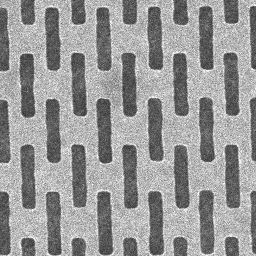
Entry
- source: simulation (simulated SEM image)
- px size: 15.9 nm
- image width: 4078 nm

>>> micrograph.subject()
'a regular array of holes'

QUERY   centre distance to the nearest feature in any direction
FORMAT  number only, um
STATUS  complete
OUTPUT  0.814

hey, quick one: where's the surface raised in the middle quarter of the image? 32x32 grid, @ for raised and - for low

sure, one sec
@@---@@@----@@@---@@@----@@----@
@@---@@@@--@@@@---@@@@--@@@----@
@@---@@@@@@@@@----@@@@@@@@@----@
@@---@@@@@@@@@----@@@@@@@@@----@
@@---@@@@@@@@@----@@@@@@@@@----@
@@----@@@@@@@@----@@@@@@@@@----@
@@----@@@@@@@@----@@@@@@@@@----@
@@----@@@@@@@@----@@@@@@@@@----@
@@----@@@@@@@@@---@@@@-@@@@----@
@@----@@----@@@---@@@---@@@----@
@@----@@----@@@---@@@---@@@----@
@@----@@----@@@---@@@----@@----@
@@----@@----@@@---@@@----@@@---@
@@@@@@@@----@@@@@@@@@----@@@@@@@
@@@@@@@@----@@@@@@@@@----@@@@@@@
@@@@@@@@----@@@@@@@@@----@@@@@@@
@@@@@@@@----@@@@@@@@@----@@@@@@@
@@@@@@@@----@@@@@@@@@----@@@@@@@
@@@@@@@@@---@@@@@@@@@----@@@@@@@
@@@@@@@@----@@@@@@@@@----@@@@@@@
@@---@@@----@@@---@@@----@@@--@@
@@---@@@----@@----@@@----@@@---@
@@---@@@@---@@@---@@@----@@----@
@@----@@@---@@@---@@@@---@@----@
@@----@@@---@@@---@@@@@@@@@----@
@@----@@@@@@@@@---@@@@@@@@@----@
@@----@@@@@@@@@---@@@@@@@@@----@
@@----@@@@@@@@@---@@@@@@@@@----@
@@----@@@@@@@@@---@@@@@@@@@@---@
@@----@@@@@@@@@---@@@@@@@@@@---@
@@----@@@@@@@@@---@@@@@@@@@@---@
@@----@@@@@@@@@----@@@@@@@@@---@